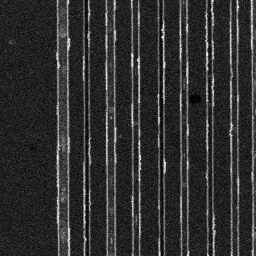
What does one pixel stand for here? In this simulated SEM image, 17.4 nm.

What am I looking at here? parallel lines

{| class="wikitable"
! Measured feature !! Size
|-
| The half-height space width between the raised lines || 0.111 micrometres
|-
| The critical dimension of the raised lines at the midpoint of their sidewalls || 0.318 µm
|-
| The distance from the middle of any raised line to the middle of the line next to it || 421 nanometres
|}